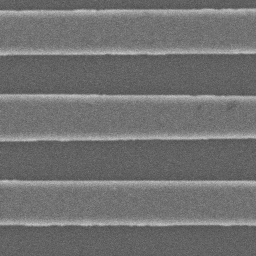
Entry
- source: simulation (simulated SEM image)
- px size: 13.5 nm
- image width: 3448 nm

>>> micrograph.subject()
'lines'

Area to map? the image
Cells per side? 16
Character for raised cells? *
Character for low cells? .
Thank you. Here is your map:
................
****************
****************
................
................
................
****************
****************
****************
................
................
****************
****************
****************
................
................